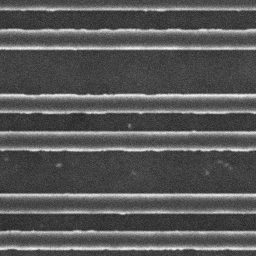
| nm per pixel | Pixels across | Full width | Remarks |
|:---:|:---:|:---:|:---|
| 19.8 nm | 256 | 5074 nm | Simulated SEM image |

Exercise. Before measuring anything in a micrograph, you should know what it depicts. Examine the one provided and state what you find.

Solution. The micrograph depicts lines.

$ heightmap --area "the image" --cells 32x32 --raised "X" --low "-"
XXXXXXXXXXXXXXXXXXXXXXXXXXXXXXXX
--------------------------------
--------------------------------
--------------------------------
XXXXXXXXXXXXXXXXXXXXXXXXXXXXXXXX
XXXXXXXXXXXXXXXXXXXXXXXXXXXXXXXX
--------------------------------
--------------------------------
--------------------------------
--------------------------------
--------------------------------
--------------------------------
XXXXXXXXXXXXXXXXXXXXXXXXXXXXXXXX
XXXXXXXXXXXXXXXXXXXXXXXXXXXXXXXX
--------------------------------
--------------------------------
--------------------------------
XXXXXXXXXXXXXXXXXXXXXXXXXXXXXXXX
XXXXXXXXXXXXXXXXXXXXXXXXXXXXXXXX
--------------------------------
--------------------------------
--------------------------------
--------------------------------
--------------------------------
XXXXXXXXXXXXXXXXXXXXXXXXXXXXXXXX
XXXXXXXXXXXXXXXXXXXXXXXXXXXXXXXX
XXXXXXXXXXXXXXXXXXXXXXXXXXXXXXXX
--------------------------------
--------------------------------
XXXXXXXXXXXXXXXXXXXXXXXXXXXXXXXX
XXXXXXXXXXXXXXXXXXXXXXXXXXXXXXXX
--------------------------------